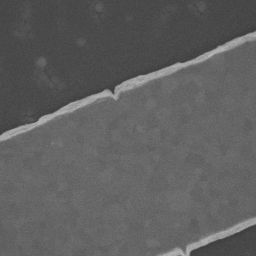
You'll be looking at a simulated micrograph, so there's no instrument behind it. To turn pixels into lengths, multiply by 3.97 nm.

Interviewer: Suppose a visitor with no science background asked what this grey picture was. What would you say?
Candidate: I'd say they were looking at one or a few lines or trenches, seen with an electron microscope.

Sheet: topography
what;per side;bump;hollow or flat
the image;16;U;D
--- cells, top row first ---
DDDDDDDDDDDDDDDD
DDDDDDDDDDDDDDDD
DDDDDDDDDDDDDDDU
DDDDDDDDDDDDDUUU
DDDDDDDDDDUUUUUU
DDDDDDDDUUUUUUUU
DDDDDUUUUUUUUUUU
DDDUUUUUUUUUUUUU
UUUUUUUUUUUUUUUU
UUUUUUUUUUUUUUUU
UUUUUUUUUUUUUUUU
UUUUUUUUUUUUUUUU
UUUUUUUUUUUUUUUU
UUUUUUUUUUUUUUUU
UUUUUUUUUUUUUUDD
UUUUUUUUUUUUDDDD